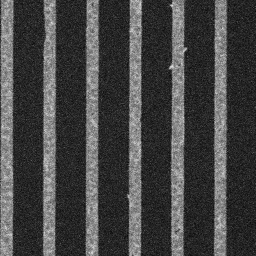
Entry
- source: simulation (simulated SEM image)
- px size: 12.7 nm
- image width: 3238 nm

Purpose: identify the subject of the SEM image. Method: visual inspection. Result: parallel lines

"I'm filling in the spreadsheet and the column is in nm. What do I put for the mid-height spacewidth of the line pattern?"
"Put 395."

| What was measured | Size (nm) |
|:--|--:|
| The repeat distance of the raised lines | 541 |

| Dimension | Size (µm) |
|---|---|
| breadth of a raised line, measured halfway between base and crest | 0.141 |